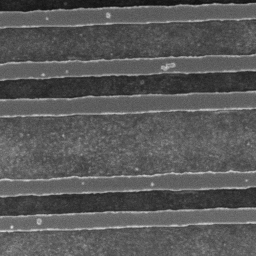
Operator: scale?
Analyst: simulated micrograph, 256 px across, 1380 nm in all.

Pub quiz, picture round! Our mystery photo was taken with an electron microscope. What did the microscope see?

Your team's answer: lines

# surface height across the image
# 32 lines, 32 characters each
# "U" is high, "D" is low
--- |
DDDDDDDDDDDDDDDDDDDDDDDDDDUUUUDU
DDDUUUUUUUUUUUUUUUUUUUUUUUUUUUUU
UUUUUUUUUUUUUUUUUUUUUUUUUUUUDUDD
DDDDDDDDDDDDDDDDDDDDDDDDDDDDDDDD
DDDDDDDDDDDDDDDDDDDDDDDDDDDDDDDD
DDDDDDDDDDDDDDDDDDDDDDDDDDDDDDDD
DDDDDDDDDDDDDDDDDDDDDDDDDDDDDDDD
DDDDDDDDDDDDUDUUUUUUUUUUUUUUUUUU
UUUUUUUUUUUUUUUUUUUUUUUUUUUUUUUU
UUUUUUUUUUUUUDDDDDDDDDDDDDDDDDDD
DDDDDDDDDDDDDDDDDDDDDDDDDDDDDDDD
DDDDDDDDDDDDDDDDDDDDDDDDDDDDDDUU
UUUUUUUUUUUUUUUUUUUUUUUUUUUUUUUU
UUUUUUUUUUUUUUUUUUUUUUUUUUUUUUUU
UUUDDDDDDDDDDDDDDDDDDDDDDDDDDDDD
DDDDDDDDDDDDDDDDDDDDDDDDDDDDDDDD
DDDDDDDDDDDDDDDDDDDDDDDDDDDDDDDD
DDDDDDDDDDDDDDDDDDDDDDDDDDDDDDDD
DDDDDDDDDDDDDDDDDDDDDDDDDDDDDDDD
DDDDDDDDDDDDDDDDDDDDDDDDDDDDDDDD
DDDDDDDDDDDDDDDDDDDDDDDDDDDDDDDD
DDDDDDDDDDDDDDDDDDDDDDDDDDUDUUUU
UUDDUUUUUUUUUUUUUUUUUUUUUUUUUUUU
UUUUUUUUUUUUUUUUUUUUUUUUUUUUUUUD
UUUDDDDDDDDDDDDDDDDDDDDDDDDDDDDD
DDDDDDDDDDDDDDDDDDDDDDDDDDDDDDDD
DDDDDDDDDDDDDUUUUUUUUUUUUUUUUUUU
UUUUUUUUUUUUUUUUUUUUUUUUUUUUUUUU
UUUUUUUUUUUUUUDDDDDDDDDDDDDDDDDD
DDDDDDDDDDDDDDDDDDDDDDDDDDDDDDDD
DDDDDDDDDDDDDDDDDDDDDDDDDDDDDDDD
DDDDDDDDDDDDDDDDDDDDDDDDDDDDDDDD